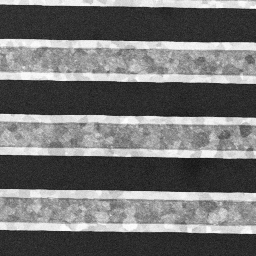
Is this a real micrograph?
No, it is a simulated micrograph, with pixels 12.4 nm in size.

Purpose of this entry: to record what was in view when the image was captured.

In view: wiring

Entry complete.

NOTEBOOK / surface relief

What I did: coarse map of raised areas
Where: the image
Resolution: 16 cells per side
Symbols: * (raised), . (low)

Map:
................
................
................
****************
****************
................
................
*******.........
****************
.......*********
................
................
****************
****************
................
................